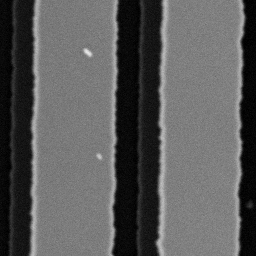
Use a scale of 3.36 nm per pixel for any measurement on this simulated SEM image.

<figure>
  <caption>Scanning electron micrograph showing lines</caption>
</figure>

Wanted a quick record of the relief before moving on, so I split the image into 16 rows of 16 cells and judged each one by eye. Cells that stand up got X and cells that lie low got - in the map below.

--XXXXX---XXXXX-
--XXXXX---XXXXX-
--XXXXX---XXXXX-
--XXXXX---XXXXX-
--XXXXX---XXXXX-
--XXXXX---XXXXX-
--XXXXX---XXXXX-
--XXXXX---XXXXX-
--XXXXX---XXXXX-
--XXXXX---XXXXX-
--XXXXX---XXXXX-
--XXXXX---XXXXX-
--XXXXX---XXXXX-
--XXXXX---XXXXX-
--XXXXX---XXXXX-
--XXXXX---XXXXX-